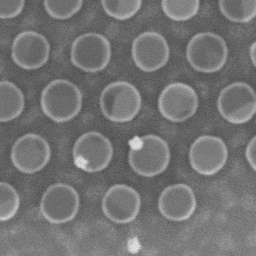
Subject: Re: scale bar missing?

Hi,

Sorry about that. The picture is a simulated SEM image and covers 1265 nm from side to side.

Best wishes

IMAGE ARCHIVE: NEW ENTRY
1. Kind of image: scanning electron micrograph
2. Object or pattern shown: a regular array of raised bodies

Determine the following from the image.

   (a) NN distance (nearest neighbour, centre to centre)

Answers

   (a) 56.6 px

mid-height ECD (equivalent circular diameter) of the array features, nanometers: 183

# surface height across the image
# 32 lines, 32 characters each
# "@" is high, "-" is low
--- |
@@@---@@@@---@@@@---@@@@@---@@@@
@@----@@@----@@@@----@@@----@@@@
-----------------------------@@-
--------------------------------
--@@@-----@@-----@@@-----@@-----
--@@@@---@@@@----@@@@---@@@@----
--@@@@---@@@@@---@@@@---@@@@---@
--@@@@---@@@@@---@@@@---@@@@----
----------@@@-----@@----@@@-----
--------------------------------
@-----@@@-----@@-------------@--
@@@--@@@@@---@@@@---@@@@----@@@@
@@@--@@@@@---@@@@---@@@@@--@@@@@
@@@--@@@@@---@@@@---@@@@---@@@@@
@@----@@@----@@@@----@@@----@@@-
--------------------------------
--------------------------------
--@@@-----@@@---@@@@-----@@-----
--@@@@---@@@@@--@@@@@---@@@@---@
--@@@@---@@@@@--@@@@@---@@@@---@
--@@@@----@@@---@@@@@---@@@@---@
---@-------------@@@-----@@-----
--------------------------------
@@----@@@-----@@-----@@---------
@@---@@@@@---@@@@---@@@@--------
@@---@@@@@---@@@@---@@@@--------
@@---@@@@----@@@@---@@@@--------
------@@------@@----------------
--------------------------------
--------------------------------
--------------------------------
--------------------------------